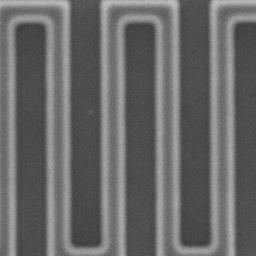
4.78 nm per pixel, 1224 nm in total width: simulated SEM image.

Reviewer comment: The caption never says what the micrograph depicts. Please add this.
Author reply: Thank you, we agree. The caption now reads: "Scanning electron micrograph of groups of lines, slits or small figures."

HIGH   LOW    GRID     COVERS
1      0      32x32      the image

11111111000001111111110000011111
11111111000001111111110000011111
11100111000001110001110000011100
11000011000001100000110000011000
11000011000001100000110000011000
11000011000001100000110000011000
11000011000001100000110000011000
11000011000001100000110000011000
11000011000001100000110000011000
11000011000001100000110000011000
11000011000001100000110000011000
11000011000001100000110000011000
11000011000001100000110000011000
11000011000001100000110000011000
11000011000001100000110000011000
11000011000001100000110000011000
11000011000001100000110000011000
11000011000001100000110000011000
11000011000001100000110000011000
11000011000001100000110000011000
11000011000001100000110000011000
11000011000001100000110000011000
11000011000001100000110000011000
11000011000001100000110000011000
11000011000001100000110000011000
11000011000001100000110000011000
11000011000001100000110000011000
11000011000001100000110000011000
11000011000001100000110000011000
11000011000001100000110000011000
11000011100001100000110000011000
11000011111111100000111111111000